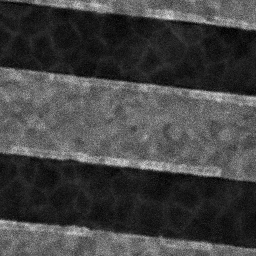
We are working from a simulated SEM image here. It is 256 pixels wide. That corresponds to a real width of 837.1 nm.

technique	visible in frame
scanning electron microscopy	one or a few lines or trenches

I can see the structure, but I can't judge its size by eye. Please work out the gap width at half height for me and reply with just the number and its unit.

221 nanometers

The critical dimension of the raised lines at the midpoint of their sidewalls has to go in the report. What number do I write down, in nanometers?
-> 272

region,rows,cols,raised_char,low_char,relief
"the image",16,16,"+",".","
....++++++++++++
.............+++
................
................
++..............
+++++++++++.....
++++++++++++++++
++++++++++++++++
++++++++++++++++
++++++++++++++++
.........+++++++
................
................
................
+++++++.........
+++++++++++++++.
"